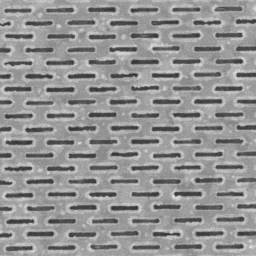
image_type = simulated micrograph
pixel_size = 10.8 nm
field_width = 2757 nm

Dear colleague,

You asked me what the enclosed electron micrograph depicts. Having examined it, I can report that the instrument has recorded a regular array of holes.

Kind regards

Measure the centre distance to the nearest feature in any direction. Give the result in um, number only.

0.259